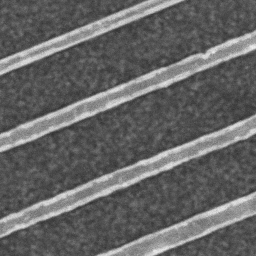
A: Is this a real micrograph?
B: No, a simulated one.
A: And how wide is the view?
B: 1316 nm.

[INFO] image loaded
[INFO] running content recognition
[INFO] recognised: one or a few lines or trenches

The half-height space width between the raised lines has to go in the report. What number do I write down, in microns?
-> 0.294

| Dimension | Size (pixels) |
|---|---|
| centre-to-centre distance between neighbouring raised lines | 75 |